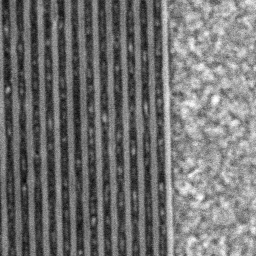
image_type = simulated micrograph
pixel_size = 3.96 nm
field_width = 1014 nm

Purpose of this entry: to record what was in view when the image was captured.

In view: parallel lines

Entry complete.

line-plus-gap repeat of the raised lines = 54.5 nm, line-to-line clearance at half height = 8.89 px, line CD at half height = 0.0213 µm